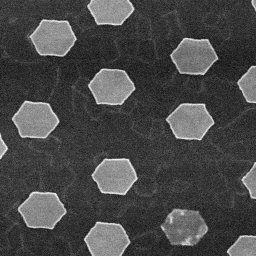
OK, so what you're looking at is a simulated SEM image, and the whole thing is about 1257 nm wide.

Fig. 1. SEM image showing raised bodies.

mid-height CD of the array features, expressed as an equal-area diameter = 0.196 µm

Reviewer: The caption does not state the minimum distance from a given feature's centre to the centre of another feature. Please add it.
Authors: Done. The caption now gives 372 nanometres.